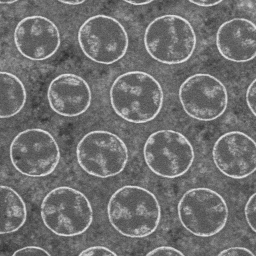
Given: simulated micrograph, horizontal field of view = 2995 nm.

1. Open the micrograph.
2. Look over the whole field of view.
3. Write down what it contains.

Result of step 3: a regular array of raised bodies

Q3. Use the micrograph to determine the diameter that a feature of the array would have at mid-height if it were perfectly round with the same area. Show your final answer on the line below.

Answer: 556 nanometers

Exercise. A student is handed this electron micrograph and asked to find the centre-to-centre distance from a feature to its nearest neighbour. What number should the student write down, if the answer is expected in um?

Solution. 0.771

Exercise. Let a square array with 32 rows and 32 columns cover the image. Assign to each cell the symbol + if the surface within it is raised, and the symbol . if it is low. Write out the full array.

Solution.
.........................++.....
................................
...+++.....+++.....++++......++.
..+++++...+++++...++++++....++++
..+++++...++++++..++++++...+++++
..+++++...++++++..++++++...+++++
...++++....+++++...+++++....++++
............+++.....+++......++.
................................
++......++.....++++.....++......
+++...+++++...++++++...+++++...+
+++...+++++...++++++...+++++...+
+++...+++++...++++++...+++++...+
+++....++++...++++++...+++++...+
+..............++++.....+++.....
................................
...+++......+.......++..........
..+++++...+++++...+++++....++++.
.++++++...++++++..++++++...+++++
.++++++...++++++..++++++...+++++
..+++++...++++++..++++++...+++++
...+++.....++++....++++.....++++
................................
+..............++...............
++....++++....+++++....++++.....
+++..++++++...++++++..++++++...+
+++..++++++...++++++..++++++...+
+++..++++++...++++++...+++++...+
++....+++++...+++++....+++++....
................++..............
................................
..++++....++++.....+++......+++.